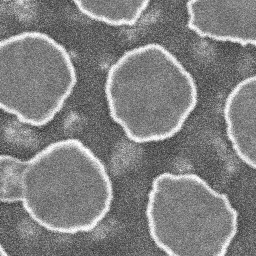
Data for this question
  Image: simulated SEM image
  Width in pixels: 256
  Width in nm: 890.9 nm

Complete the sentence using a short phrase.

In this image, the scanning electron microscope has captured raised bodies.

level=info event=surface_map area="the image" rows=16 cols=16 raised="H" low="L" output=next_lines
LLLLLHHHHLLLHHHH
LLLLLLLLLLLLHHHH
LHHLLLLLLLLLLLLH
HHHHLLLLHHHLLLLL
HHHHHLLHHHHHLLLL
HHHHLLLHHHHHLLLH
HHHHLLLHHHHHLLHH
LLHLLLLHHHHLLLHH
LLLLLLLLHHLLLLHH
LLLHHLLLLLLLLLLH
HHHHHHLLLLLLLLLL
HHHHHHHLLLHHHLLL
HHHHHHHLLHHHHHLL
LLHHHHLLLHHHHHHL
LLLLLLLLLLHHHHHL
LLLLLLLLLLHHHHLL